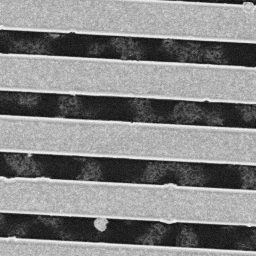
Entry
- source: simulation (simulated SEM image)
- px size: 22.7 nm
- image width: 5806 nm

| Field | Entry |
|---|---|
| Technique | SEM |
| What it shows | one or a few lines or trenches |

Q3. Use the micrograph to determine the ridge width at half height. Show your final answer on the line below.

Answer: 781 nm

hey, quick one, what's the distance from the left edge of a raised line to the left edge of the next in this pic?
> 1390 nm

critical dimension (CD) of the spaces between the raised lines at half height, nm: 606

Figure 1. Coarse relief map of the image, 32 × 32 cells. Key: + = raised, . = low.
++++++++++++++++++++++++++....++
++++++++++++++++++++++++++++++++
++++++++++++++++++++++++++++++++
.+++++++++++++++++++++++++++++++
...................+++++++++++++
................................
................................
+++++++++++++...................
++++++++++++++++++++++++++++++..
++++++++++++++++++++++++++++++++
++++++++++++++++++++++++++++++++
.......+++++++++++++++++++++++++
..........................++++++
................................
................................
++++++++++++++++++..............
++++++++++++++++++++++++++++++++
++++++++++++++++++++++++++++++++
++++++++++++++++++++++++++++++++
..............++++++++++++++++++
................................
................................
+++++++.........................
++++++++++++++++++++++++........
++++++++++++++++++++++++++++++++
++++++++++++++++++++++++++++++++
..++++++++++++++++++++++++++++++
....................++++++++++++
................................
................................
++++++++++++....................
+++++++++++++++++++++++++++++++.